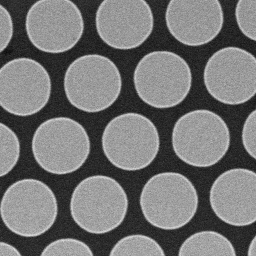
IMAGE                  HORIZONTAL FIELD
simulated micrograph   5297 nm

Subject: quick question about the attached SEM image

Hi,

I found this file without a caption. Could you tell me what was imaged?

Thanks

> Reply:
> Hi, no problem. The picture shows an array of small figures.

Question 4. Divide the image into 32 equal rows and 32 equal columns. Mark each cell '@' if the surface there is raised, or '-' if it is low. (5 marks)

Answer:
----@@@@@----@@@@@---@@@@@@---@@
@---@@@@@@--@@@@@@@--@@@@@@@-@@@
@--@@@@@@@--@@@@@@@--@@@@@@@--@@
@--@@@@@@@--@@@@@@@--@@@@@@@--@@
@---@@@@@@--@@@@@@@---@@@@@----@
@---@@@@@-----@@@@-----@@-------
------@@------------@------@@@@-
--@@-----@@@@@----@@@@@---@@@@@@
@@@@@----@@@@@@--@@@@@@@--@@@@@@
@@@@@@--@@@@@@@--@@@@@@@--@@@@@@
@@@@@@--@@@@@@@--@@@@@@@--@@@@@@
@@@@@@--@@@@@@@--@@@@@@---@@@@@@
@@@@@@---@@@@@----@@@@@----@@@@-
@@@@@-----@@@-------------------
---------------@@@-----@@@@----@
-----@@@@@----@@@@@---@@@@@@---@
@@--@@@@@@@--@@@@@@@--@@@@@@@-@@
@@--@@@@@@@--@@@@@@@--@@@@@@@-@@
@@--@@@@@@@--@@@@@@@--@@@@@@---@
@@--@@@@@@@--@@@@@@---@@@@@@----
@@---@@@@@----@@@@@-----@@@-----
@-----@@@-------------------@@@@
---@-------@@@-----@@@@----@@@@@
-@@@@@----@@@@@---@@@@@@--@@@@@@
@@@@@@@--@@@@@@@--@@@@@@@-@@@@@@
@@@@@@@--@@@@@@@--@@@@@@@-@@@@@@
@@@@@@@--@@@@@@@--@@@@@@---@@@@@
@@@@@@@--@@@@@@---@@@@@@----@@@@
-@@@@@----@@@@------@@----------
---@------------@@------@@@@----
@-----@@@@@----@@@@@---@@@@@@--@
@@---@@@@@@---@@@@@@--@@@@@@@--@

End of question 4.